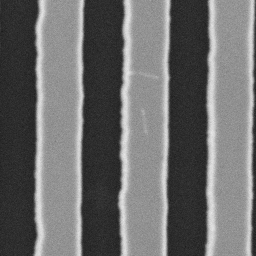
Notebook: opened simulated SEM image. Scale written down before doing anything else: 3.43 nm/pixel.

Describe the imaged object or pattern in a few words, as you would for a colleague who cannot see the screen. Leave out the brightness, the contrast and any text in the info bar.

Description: lines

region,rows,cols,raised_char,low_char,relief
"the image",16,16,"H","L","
LLHHHLLLHHHLLHHH
LLHHHLLLHHHLLHHH
LLHHHLLLHHHLLHHH
LLHHHLLLHHHLLHHH
LLHHHLLLHHHLLHHH
LLHHHLLLHHHLLHHH
LLHHHLLLHHHLLHHH
LLHHHLLLHHHLLHHH
LLHHHLLLHHHLLHHH
LLHHHLLLHHHLLHHH
LLHHHLLLHHLLLHHH
LLHHHLLLHHLLLHHH
LLHHHLLHHHLLLHHH
LLHHHLLLHHLLLHHH
LLHHHLLLHHLLLHHH
LLHHHLLLHHLLLHHH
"